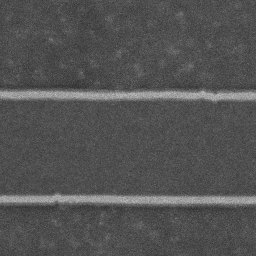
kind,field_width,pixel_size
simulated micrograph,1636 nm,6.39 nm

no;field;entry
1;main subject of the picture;one or a few lines or trenches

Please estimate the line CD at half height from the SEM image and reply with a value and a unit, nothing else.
671 nanometers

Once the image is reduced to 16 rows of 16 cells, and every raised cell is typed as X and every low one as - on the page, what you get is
----------------
----------------
----------------
----------------
----------------
----------------
XXXXXXXXXXXXXXXX
XXXXXXXXXXXXXXXX
XXXXXXXXXXXXXXXX
XXXXXXXXXXXXXXXX
XXXXXXXXXXXXXXXX
XXXXXXXXXXXXXXXX
--------XXXX-XXX
----------------
----------------
----------------